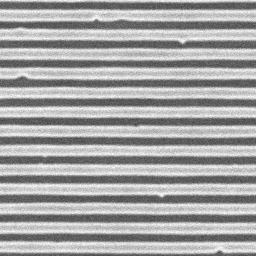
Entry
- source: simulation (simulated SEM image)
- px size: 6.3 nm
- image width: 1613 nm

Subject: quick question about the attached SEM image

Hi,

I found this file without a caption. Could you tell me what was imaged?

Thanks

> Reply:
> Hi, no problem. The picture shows parallel lines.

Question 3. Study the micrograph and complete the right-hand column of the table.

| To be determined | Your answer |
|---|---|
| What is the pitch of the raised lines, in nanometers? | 122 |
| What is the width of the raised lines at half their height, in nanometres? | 63.8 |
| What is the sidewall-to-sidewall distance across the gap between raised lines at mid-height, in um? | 0.0575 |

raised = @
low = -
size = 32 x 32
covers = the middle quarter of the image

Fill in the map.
--------------------------------
@@@@@@@@@@@@@@@@@@@@@@@@@@@@@@@@
@@@@@@@@@@@@@@@@@@@@@@@@@@@@@@@@
------@@@@@@@@@@@@@@@@@@@@@@@@@@
--------------------------------
--------------------------------
@@@@@@@@@@@@@@@@@@@@@@@@@@@@@@@@
@@@@@@@@@@@@@@@@@@@@@@@@@@@@@@@@
-----------------------@@@@@----
--------------------------------
--------------------------------
@@@@@@@@@@@@@@@@@@@@@@@@@@@@@@@@
@@@@@@@@@@@@@@@@@@@@@@@@@@@@@@@@
--------------------------------
--------------------------------
--------------------------------
@@@@@@@@@@@@@@@@@@@@@@@@@@@@@@@@
@@@@@@@@@@@@@@@@@@@@@@@@@@@@@@@@
--------------------------------
--------------------------------
@@@@@@@@@@----------------------
@@@@@@@@@@@@@@@@@@@@@@@@@@@@@@@@
@@@@@@@@@@@@@@@@@@@@@@@@@@@@@@@@
--------------------------------
--------------------------------
@@@@@@@@@--@@@@@@@@@@@@@@@@@@@--
@@@@@@@@@@@@@@@@@@@@@@@@@@@@@@@@
@@@@@@@@@@@@@@@@@@@@@@@@@@@@@@@@
--------------------------------
--------------------------------
@@@@@@@@@@@@@@@@@@@@@@@@@@@@@@@@
@@@@@@@@@@@@@@@@@@@@@@@@@@@@@@@@